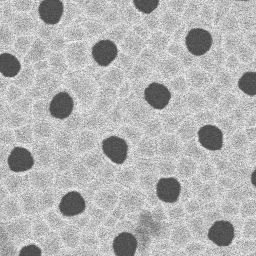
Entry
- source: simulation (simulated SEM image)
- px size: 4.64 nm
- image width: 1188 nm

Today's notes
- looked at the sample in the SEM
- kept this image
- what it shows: a regular array of holes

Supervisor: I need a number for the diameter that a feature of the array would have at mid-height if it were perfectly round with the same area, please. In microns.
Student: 0.117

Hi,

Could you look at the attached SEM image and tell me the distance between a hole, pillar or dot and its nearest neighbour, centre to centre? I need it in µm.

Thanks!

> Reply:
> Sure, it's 0.316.